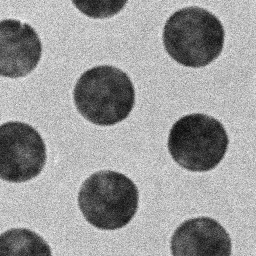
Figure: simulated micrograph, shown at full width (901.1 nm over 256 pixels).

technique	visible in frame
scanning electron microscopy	holes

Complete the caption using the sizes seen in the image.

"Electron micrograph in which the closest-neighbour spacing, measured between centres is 0.368 micrometres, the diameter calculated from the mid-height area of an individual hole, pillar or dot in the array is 0.213 um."